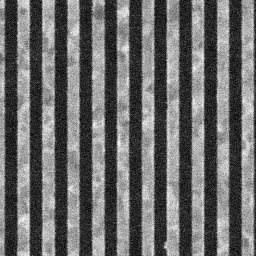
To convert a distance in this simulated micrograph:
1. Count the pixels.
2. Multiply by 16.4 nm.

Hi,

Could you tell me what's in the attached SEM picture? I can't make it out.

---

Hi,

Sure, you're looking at parallel lines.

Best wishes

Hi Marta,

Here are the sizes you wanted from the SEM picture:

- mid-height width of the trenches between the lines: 0.222 micrometres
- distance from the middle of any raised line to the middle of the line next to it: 410 nanometers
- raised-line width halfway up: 0.183 um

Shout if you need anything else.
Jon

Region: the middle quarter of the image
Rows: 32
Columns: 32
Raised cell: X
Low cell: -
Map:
-XXX---XXX----XX----XX----XXX---
-XXX---XXX----XX----XX----XXX---
-XXX---XXX----XX----XX----XXX---
-XXX---XXX----XX----XX----XXX---
-XXX---XXX----XX----XX----XXX---
-XXX---XXX----XX----XX----XXX---
-XXX---XXX----XX----XX----XXX---
-XXX---XXX-----X----XX----XXX---
-XXX---XXX----XX----XX----XXX---
-XXX---XXX----XX----XX----XXX---
-XXX---XXX----XX----XX----XXX---
-XXX---XXX----XX----XX----XXX---
-XXX---XXX----XX----XX----XXX---
-XXX---XXX----XX----XX----XXX---
-XXX---X------XX----XX----XXX---
-XXX-----X----XX----XX----XXX---
-XXX---XXX----XX----XX----XXX---
-XXX---XXX----XX----XX----XXX---
-XXX---XXX----XX----XX----XXX---
-XXX---XXX----XX----XX----XXX---
-XXX---XXX----XX----XX----XXX---
-XXX---XXX----XX----XX----XXX---
-XXX---XXX----XX----XX----XXX---
-XXX---XXX----XX----XX----XXX---
-XXX---XXX----XX----XX----XXX---
-XXX---XXX----XX----XX----XXX---
-XXX---XXX----XX----XX----XXX---
-XXX---XXX----XX----XX----XXX---
-XXX---XXX----XX----XX----XXX---
-XXX---XXX----XX----XX----XXX---
-XXX---XXX---XXX----XX----XXX---
-XXX---XXX---XXX----XX----XXX---